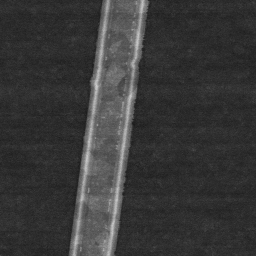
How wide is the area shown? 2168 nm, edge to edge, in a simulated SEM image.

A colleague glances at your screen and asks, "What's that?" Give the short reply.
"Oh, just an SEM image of one or a few lines or trenches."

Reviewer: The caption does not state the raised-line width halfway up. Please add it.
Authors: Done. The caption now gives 291 nm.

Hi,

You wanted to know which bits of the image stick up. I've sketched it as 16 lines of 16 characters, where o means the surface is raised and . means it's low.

.......oo.......
.......oo.......
......ooo.......
......oo........
......oo........
......oo........
......oo........
......oo........
......oo........
......oo........
.....ooo........
.....oo.........
.....oo.........
.....oo.........
.....oo.........
.....oo.........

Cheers